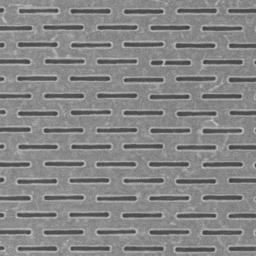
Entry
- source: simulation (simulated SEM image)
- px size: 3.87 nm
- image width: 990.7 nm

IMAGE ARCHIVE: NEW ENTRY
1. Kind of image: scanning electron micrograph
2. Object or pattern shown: a regular array of holes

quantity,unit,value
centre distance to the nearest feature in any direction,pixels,30.6